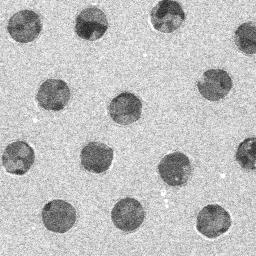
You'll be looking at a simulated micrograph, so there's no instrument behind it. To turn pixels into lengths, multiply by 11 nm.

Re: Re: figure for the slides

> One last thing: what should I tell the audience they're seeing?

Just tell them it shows a regular array of raised bodies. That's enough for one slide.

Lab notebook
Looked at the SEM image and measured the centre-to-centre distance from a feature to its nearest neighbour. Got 736 nm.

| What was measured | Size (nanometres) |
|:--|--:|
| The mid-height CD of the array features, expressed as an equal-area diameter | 382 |